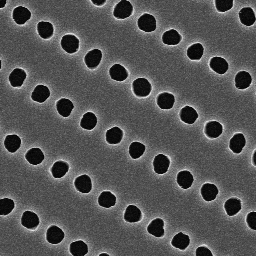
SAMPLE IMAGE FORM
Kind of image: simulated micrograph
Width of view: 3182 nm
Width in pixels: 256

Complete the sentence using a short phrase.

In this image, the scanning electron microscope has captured a regular array of holes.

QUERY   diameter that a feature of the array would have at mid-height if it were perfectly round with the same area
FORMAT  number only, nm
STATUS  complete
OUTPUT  222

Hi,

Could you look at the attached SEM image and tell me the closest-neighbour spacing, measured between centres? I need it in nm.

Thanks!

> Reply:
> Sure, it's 343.